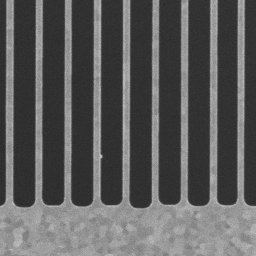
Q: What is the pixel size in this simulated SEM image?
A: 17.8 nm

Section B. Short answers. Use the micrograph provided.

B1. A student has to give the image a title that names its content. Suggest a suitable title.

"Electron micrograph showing parallel lines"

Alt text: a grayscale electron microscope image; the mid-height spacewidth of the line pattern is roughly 406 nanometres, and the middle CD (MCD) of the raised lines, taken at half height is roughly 0.112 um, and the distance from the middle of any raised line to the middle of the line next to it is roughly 516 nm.